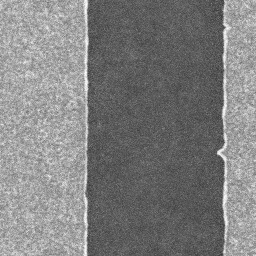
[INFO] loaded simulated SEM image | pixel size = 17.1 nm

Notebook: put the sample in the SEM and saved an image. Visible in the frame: one or a few lines or trenches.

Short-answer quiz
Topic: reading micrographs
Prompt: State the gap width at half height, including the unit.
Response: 2350 nanometers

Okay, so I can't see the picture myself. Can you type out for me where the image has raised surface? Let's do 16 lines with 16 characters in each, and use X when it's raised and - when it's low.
XXXXX---------XX
XXXXX---------XX
XXXXX---------XX
XXXXX---------XX
XXXXX---------XX
XXXXX---------XX
XXXXX---------XX
XXXXX---------XX
XXXXX---------XX
XXXXX---------XX
XXXXX---------XX
XXXXX---------XX
XXXXX---------XX
XXXXX---------XX
XXXXX---------XX
XXXXX---------XX